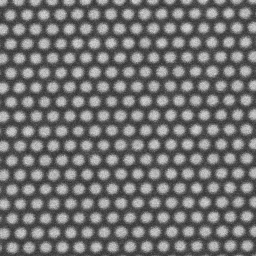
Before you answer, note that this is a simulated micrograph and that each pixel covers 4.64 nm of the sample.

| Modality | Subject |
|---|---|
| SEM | a regular array of raised bodies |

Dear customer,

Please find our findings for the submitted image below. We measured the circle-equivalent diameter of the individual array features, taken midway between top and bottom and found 46.6 nm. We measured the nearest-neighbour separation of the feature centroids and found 76.6 nm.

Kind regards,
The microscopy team